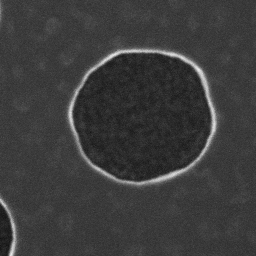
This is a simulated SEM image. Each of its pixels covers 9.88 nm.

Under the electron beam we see holes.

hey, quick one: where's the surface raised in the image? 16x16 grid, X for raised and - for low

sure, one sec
XXXXXXXXXXXXXXXX
XXXXXXXXXXXXXXXX
XXXXXXXXXXXXXXXX
XXXXXXX----XXXXX
XXXXXX------XXXX
XXXXX--------XXX
XXXXX--------XXX
XXXXX--------XXX
XXXXX--------XXX
XXXXX--------XXX
XXXXXX------XXXX
XXXXXXXXXXXXXXXX
XXXXXXXXXXXXXXXX
-XXXXXXXXXXXXXXX
-XXXXXXXXXXXXXXX
-XXXXXXXXXXXXXXX